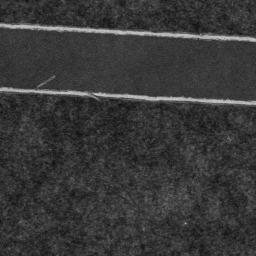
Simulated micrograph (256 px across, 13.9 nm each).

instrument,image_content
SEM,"one or a few lines or trenches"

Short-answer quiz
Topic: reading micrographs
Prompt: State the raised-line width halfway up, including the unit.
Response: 0.895 micrometres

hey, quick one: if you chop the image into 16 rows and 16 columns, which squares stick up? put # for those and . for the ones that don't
................
................
################
################
################
################
................
................
................
................
................
................
................
................
................
................